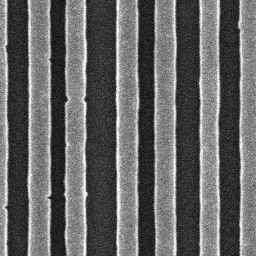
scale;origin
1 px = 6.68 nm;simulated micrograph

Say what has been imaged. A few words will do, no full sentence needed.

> parallel lines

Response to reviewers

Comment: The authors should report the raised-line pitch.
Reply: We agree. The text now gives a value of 284 nanometres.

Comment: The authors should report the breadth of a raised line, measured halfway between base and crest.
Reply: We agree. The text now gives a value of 133 nm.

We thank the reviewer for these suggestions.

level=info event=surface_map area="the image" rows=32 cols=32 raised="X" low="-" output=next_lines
X---XX--XXX----XX--XXX---XX---XX
X---XX--XXX----XX--XXX---XX---XX
X---XX--XXX----XX--XXX---XX---XX
X---XX--XXX----XX--XXX---XX---XX
X---XX--XXX----XX--XXX---XX---XX
X---XX--XXX----XX--XXX---XX---XX
X---XX--XXX----XX--XXX---XX---XX
X---XX--XXX----XX--XXX---XX---XX
X---XX--XXX----XX--XXX---XX---XX
X---XX--XXX----XX--XXX---XX---XX
X---XX--XXX----XX--XXX---XX---XX
X---XX--XXX----XX--XXX---XX---XX
X---XX--XXX----XX--XXX---XX---XX
X---XX--XXX----XX---XX---XX---XX
X---XX--XXX----XX--XXX---XX---XX
X---XX--XXX----XX--XXX---XX---XX
X---XX--XXX----XX--XXX---XX---XX
X---XX--XXX----XX--XXX---XX---XX
X---XX--XX-----XX--XXX---XX---XX
X---XX--XX-----XX---XX---XX---XX
X---XX--XXX----XX---XX---XX---XX
X---XX--XXX----XX---XX---XX---XX
X---XX--XXX----XX---XX---XX---XX
X---XX--XXX----XX--XXX---XX---XX
X---XX--XXX----XX--XXX---XX---XX
X---XX--XX-----XX--XXX---XX---XX
X---XX--XXX----XX--XXX---XX---XX
X---XX--XXX----XX---XX---XX---XX
X---XX--XXX----XX---XX---XX---XX
X---XX--XXX----XX---XX---XX---XX
X---XX--XXX----XX---XX---XX---XX
X---XX--XXX----XX---XX---XX---XX